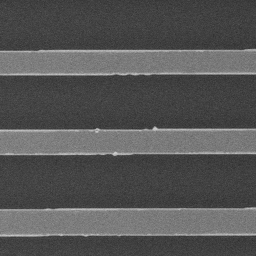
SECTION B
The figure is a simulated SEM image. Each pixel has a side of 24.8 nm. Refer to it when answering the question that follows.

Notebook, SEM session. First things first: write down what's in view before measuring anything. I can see lines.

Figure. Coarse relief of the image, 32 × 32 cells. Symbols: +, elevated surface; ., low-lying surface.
................................
................................
................................
................................
................................
................................
++++++++++++++++++++++++++++++++
++++++++++++++++++++++++++++++++
++++++++++++++++++++++++++++++++
................................
................................
................................
................................
................................
................................
................................
++++++++++++++++++++++++++++++++
++++++++++++++++++++++++++++++++
++++++++++++++++++++++++++++++++
................................
................................
................................
................................
................................
................................
................................
++++++++++++++++++++++++++++++++
++++++++++++++++++++++++++++++++
++++++++++++++++++++++++++++++++
................................
................................
................................